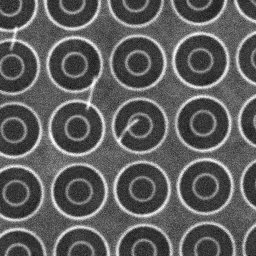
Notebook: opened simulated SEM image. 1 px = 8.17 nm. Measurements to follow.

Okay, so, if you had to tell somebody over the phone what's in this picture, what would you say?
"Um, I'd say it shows an array of small figures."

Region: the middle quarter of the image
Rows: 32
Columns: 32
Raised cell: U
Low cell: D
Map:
UUUUUUDDDUUUDDDDUUUUUDDDDUUUDDDU
UUUUUDDDDUUUDDDDUUUUUDDDDUUUDDDD
DUUUUDDDDUUUDDDDDUUDDDDDUUUUDDDD
DDDDDDDDUUUUUDDDDDDDDDDDUUUUUDDD
DDDDDDDUUUUUUUDDDDDDDDDUUUUUUUDD
DDDDDDDUUUUUUUUDDDDDDUUUUUUUUUUU
UDDDDUUUUUUUUUUUUUUUUUUUUUUUUUUU
UUUUUUUUUUUUUUUUUUUUUUUUUUUUUUUU
UUUUUUUUUUUUUUUUUUUUUUUUUUUUUUUU
UUDDDUUUUUUUUUUUDDDDDDUUUUUUUUUD
DDDDDDDUUUUUUUUDDDDDDDDUUUUUUUDD
DDDDDDDDUUUUUUDDDDDDDDDDUUUUUDDD
DDDDDDDDDUUUUDDDDDUUDDDDDUUUUDDD
DDUUUDDDDUUUUDDDDUUUUDDDDUUUDDDD
DUUUUUDDDDUUDDDDUUUUUUDDDDUUDDDD
UUUUUUDDDDUUDDDDUUUUUUDDDDUUDDDD
UUUUUUDDDDUUUDDDUUUUUUDDDDUUDDDD
DUUUUUDDDDUUUDDDDUUUUDDDDUUUUDDD
DDUUUDDDDUUUUDDDDDDDDDDDDUUUUDDD
DDDDDDDDDUUUUUDDDDDDDDDDUUUUUUDD
DDDDDDDDUUUUUUUDDDDDDDDUUUUUUUUD
DDDDDDDUUUUUUUUUDDDDDDUUUUUUUUUU
UUDDUUUUUUUUUUUUUUUUUUUUUUUUUUUU
UUUUUUUUUUUUUUUUUUUUUUUUUUUUUUUU
UUUUUUUUUUUUUUUUUUUUUUUUUUUUUUUU
UUDDDDUUUUUUUUUUDDDDDDDUUUUUUUUD
DDDDDDDDUUUUUUUDDDDDDDDDUUUUUUDD
DDDDDDDDDUUUUUDDDDDDDDDDDUUUUUDD
DDDDDDDDDDUUUDDDDDUUUDDDDDUUUDDD
DDUUUUDDDDUUUDDDDUUUUUDDDDUUUDDD
DUUUUUUDDDUUUDDDDUUUUUUDDDUUUDDD
DUUUUUUDDDDUUDDDDUUUUUUDDDUUUDDD